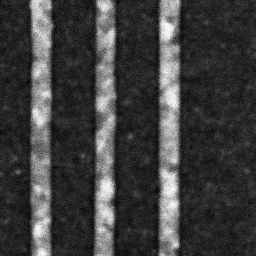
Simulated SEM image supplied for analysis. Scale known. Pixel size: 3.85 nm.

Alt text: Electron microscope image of one or a few lines or trenches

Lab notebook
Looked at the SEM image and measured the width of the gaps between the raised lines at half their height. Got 176 nm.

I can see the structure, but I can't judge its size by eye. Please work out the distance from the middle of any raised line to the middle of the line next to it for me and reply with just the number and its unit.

64 px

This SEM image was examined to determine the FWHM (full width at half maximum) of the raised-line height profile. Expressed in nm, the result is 69.8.